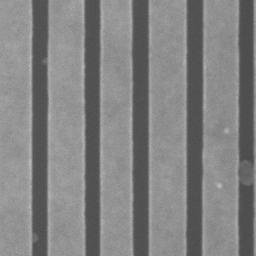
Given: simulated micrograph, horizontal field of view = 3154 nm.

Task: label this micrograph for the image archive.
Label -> lines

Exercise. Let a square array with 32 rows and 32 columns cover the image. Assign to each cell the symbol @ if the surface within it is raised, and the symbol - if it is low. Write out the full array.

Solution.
@@@@--@@@@---@@@---@@@@--@@@@@--
@@@@--@@@@---@@@---@@@@--@@@@@--
@@@@--@@@@---@@@---@@@@--@@@@@--
@@@@--@@@@@--@@@---@@@@--@@@@@--
@@@@--@@@@@--@@@---@@@@--@@@@@--
@@@@--@@@@---@@@---@@@@--@@@@@--
@@@@--@@@@---@@@---@@@@--@@@@@--
@@@@--@@@@---@@@---@@@@--@@@@@--
@@@@--@@@@@--@@@---@@@@--@@@@@--
@@@@--@@@@@--@@@---@@@@--@@@@@--
@@@@--@@@@---@@@@--@@@@--@@@@@--
@@@@--@@@@---@@@---@@@@--@@@@@--
@@@@--@@@@@--@@@---@@@@--@@@@@--
@@@@--@@@@---@@@---@@@@--@@@@@--
@@@@--@@@@@--@@@---@@@@--@@@@@--
@@@@--@@@@@--@@@---@@@@--@@@@@--
@@@@--@@@@@--@@@---@@@@--@@@@@--
@@@@--@@@@@--@@@@--@@@@--@@@@@--
@@@@--@@@@@--@@@---@@@@--@@@@@--
@@@@--@@@@@--@@@@--@@@@--@@@@@--
@@@@--@@@@@--@@@@--@@@@--@@@@@--
@@@@--@@@@@--@@@---@@@@--@@@@@--
@@@@--@@@@@--@@@---@@@@--@@@@@--
@@@@--@@@@@--@@@@--@@@@--@@@@@--
@@@@--@@@@@--@@@@--@@@@--@@@@@--
@@@@--@@@@@--@@@---@@@@--@@@@@--
@@@@--@@@@@--@@@@--@@@@--@@@@@--
@@@@--@@@@@--@@@@--@@@@--@@@@@--
@@@@--@@@@@--@@@@--@@@@--@@@@@--
@@@@--@@@@@--@@@@--@@@@--@@@@@--
@@@@--@@@@@--@@@@--@@@@--@@@@@--
@@@@--@@@@@--@@@@--@@@@--@@@@@--